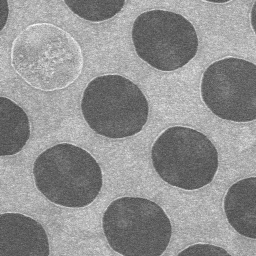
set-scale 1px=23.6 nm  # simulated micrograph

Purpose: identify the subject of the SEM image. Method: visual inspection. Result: holes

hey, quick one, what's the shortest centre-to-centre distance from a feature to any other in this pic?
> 1.97 micrometres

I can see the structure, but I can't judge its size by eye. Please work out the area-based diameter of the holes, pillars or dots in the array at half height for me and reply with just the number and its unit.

65.7 pixels